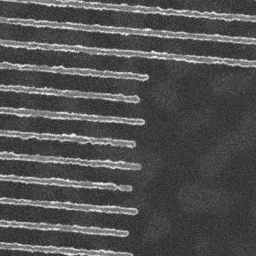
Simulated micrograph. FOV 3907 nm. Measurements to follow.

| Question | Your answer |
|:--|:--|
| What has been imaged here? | parallel lines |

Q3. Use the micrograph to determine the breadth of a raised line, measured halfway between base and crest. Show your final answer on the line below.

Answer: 5.98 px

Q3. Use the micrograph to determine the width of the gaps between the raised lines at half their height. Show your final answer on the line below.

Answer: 253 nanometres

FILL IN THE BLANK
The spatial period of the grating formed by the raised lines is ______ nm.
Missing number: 343